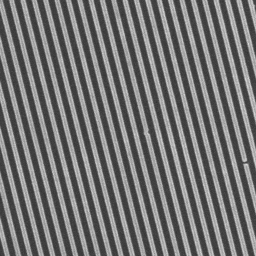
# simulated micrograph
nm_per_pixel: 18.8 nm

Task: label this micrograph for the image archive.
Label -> parallel lines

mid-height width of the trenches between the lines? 128 nanometers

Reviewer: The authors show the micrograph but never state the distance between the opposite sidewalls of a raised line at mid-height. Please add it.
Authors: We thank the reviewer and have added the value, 73.1 nm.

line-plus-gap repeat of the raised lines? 208 nm